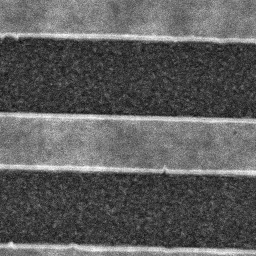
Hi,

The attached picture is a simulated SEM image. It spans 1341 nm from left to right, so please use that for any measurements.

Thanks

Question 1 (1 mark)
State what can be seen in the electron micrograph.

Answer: one or a few lines or trenches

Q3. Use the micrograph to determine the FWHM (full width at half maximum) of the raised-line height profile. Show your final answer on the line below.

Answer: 276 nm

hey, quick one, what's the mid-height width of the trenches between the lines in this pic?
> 78.7 pixels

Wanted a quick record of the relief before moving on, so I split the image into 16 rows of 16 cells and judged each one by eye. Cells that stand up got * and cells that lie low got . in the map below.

****************
****************
.............***
................
................
................
................
**************..
****************
****************
...*************
................
................
................
................
******..........